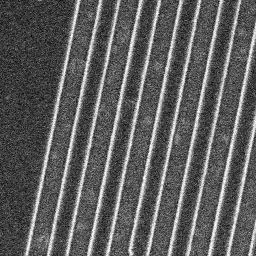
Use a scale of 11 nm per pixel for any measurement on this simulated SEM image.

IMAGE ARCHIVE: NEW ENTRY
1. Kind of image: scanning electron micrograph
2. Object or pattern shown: parallel lines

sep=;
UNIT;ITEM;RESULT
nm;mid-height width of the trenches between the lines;221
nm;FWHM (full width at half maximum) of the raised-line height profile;210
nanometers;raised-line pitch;433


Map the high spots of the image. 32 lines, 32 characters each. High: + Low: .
++++++++++..+++...++...++..+++..
++++++++++..+++..+++..+++..+++..
+++++++++...++...+++..+++..+++..
+++++++++...++...++...++...++...
+++++++++...++...++...++...++...
+++++++++..+++..+++..+++..+++..+
+++++++++..+++..+++..+++..+++..+
++++++++...+++..+++..+++..++...+
++++++++...++...++...++...++...+
++++++++...++...++...++...++...+
++++++++..+++..+++..+++..+++..++
++++++++..+++..+++..+++..+++..++
+++++++...++...++...++...++...++
+++++++...++...++...++...++...++
+++++++...++...++...++...++...++
+++++++..+++..+++..+++..+++..+++
+++++++..+++..+++..+++..+++..+++
++++++...++...++...++...++...+++
++++++...++...++...++...++...++.
++++++..+++...++...++...++...++.
++++++..+++..+++..+++..+++..+++.
++++++..+++..+++..+++..+++..+++.
+++++...++...++...++...++...++..
+++++...++...++...++...++...++..
+++++..+++...++...++...++...++..
+++++..+++..+++..+++..+++..+++..
++++...++...+++..+++..+++..+++..
++++...++...++...++...++...++...
++++...++...++...++...++...++...
++++..+++...++...++...++...++...
++++..+++..+++..+++..+++..+++..+
+++...++...+++..+++..+++..+++..+